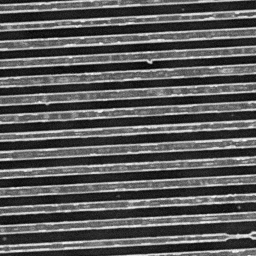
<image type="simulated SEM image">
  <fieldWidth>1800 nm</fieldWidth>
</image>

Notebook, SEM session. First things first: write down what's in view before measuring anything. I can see parallel lines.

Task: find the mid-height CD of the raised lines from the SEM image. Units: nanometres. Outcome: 61.4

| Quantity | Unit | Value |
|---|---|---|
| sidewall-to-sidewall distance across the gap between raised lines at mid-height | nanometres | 68.5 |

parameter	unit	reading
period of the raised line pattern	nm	130